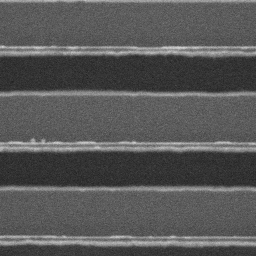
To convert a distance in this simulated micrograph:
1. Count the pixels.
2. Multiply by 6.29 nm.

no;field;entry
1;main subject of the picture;lines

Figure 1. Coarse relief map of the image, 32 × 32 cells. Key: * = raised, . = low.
********************************
********************************
********************************
********************************
********************************
********************************
********************************
................................
................................
................................
................................
................................
********************************
********************************
********************************
********************************
********************************
********************************
********************************
................................
................................
................................
................................
................................
********************************
********************************
********************************
********************************
********************************
********************************
................................
................................